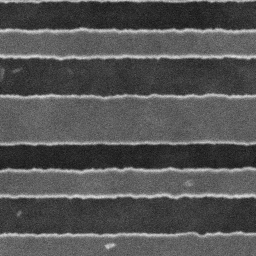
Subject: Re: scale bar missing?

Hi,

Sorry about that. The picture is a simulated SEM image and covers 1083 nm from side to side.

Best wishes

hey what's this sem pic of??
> lines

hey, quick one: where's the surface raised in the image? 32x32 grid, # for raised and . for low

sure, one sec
................................
................................
................................
................................
################################
################################
################################
................................
................................
................................
................................
................................
################################
################################
################################
################################
################################
################################
................................
................................
................................
################################
################################
################################
####################.###########
................................
................................
................................
................................
################################
################################
################################